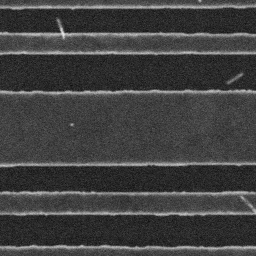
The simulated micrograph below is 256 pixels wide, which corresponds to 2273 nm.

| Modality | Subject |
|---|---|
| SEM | lines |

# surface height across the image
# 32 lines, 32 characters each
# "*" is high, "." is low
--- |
********************************
................................
................................
................................
********************************
********************************
********************************
................................
................................
................................
................................
*...**......*.******************
********************************
********************************
********************************
********************************
********************************
********************************
********************************
********************************
********************************
................................
................................
................................
********************************
********************************
********************************
................................
................................
................................
................................
********************************